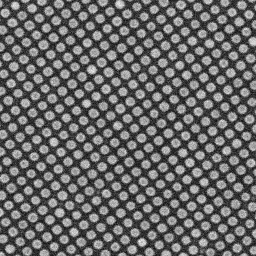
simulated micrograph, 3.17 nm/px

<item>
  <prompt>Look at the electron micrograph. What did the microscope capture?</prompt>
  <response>a regular array of raised bodies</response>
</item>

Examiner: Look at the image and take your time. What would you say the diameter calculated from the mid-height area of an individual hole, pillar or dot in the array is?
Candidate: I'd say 0.0265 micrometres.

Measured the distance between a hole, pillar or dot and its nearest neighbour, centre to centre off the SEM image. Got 38 nm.